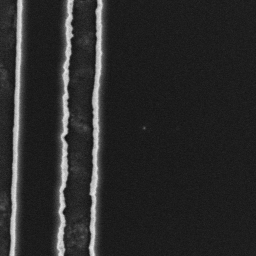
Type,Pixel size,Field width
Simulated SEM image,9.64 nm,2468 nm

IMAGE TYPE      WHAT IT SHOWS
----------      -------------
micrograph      one or a few lines or trenches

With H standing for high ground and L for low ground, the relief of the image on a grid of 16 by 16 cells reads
LHHHLLHHHHHHHHHH
LHHHLLHHHHHHHHHH
LHHHLLHHHHHHHHHH
LHHHLLHHHHHHHHHH
LHHHLLHHHHHHHHHH
LHHHLLHHHHHHHHHH
LHHHLLHHHHHHHHHH
LHHHLLHHHHHHHHHH
LHHHLLHHHHHHHHHH
LHHHLLHHHHHHHHHH
LHHHLLHHHHHHHHHH
LHHHLLHHHHHHHHHH
LHHHLLHHHHHHHHHH
LHHHLLHHHHHHHHHH
LHHHLLHHHHHHHHHH
LHHHLLHHHHHHHHHH